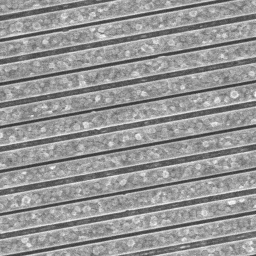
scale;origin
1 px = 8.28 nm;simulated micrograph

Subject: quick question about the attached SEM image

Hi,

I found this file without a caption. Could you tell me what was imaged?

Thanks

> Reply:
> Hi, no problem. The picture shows parallel lines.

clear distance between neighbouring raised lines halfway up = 4.93 pixels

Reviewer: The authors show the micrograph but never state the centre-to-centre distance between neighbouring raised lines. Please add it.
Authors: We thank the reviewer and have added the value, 21.4 pixels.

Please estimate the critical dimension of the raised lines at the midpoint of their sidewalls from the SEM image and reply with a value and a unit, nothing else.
132 nm